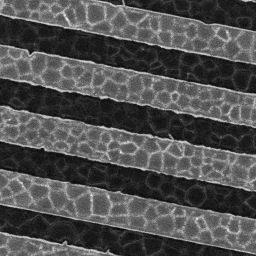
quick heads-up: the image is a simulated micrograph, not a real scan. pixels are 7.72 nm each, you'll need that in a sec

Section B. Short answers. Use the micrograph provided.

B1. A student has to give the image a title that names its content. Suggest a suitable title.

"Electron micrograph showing one or a few lines or trenches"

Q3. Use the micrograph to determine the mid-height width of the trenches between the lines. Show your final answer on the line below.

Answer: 224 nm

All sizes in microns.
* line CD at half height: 0.255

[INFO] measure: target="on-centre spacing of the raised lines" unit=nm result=476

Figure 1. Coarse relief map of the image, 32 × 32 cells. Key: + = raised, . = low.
++++++++++++++..................
++++++++++++++++++++............
...+++++++++++++++++++++........
........++++++++++++++++++++++..
.............+++++++++++++++++++
...................+++++++++++++
+++.....................++++++++
++++++++++...................+++
++++++++++++++..................
++++++++++++++++++++............
....+++++++++++++++++++++.......
.........+++++++++++++++++++++..
..............++++++++++++++++++
+...................++++++++++++
+++++....................+++++++
+++++++++++...................++
++++++++++++++++................
++++++++++++++++++++++..........
....++++++++++++++++++++++......
..........++++++++++++++++++++++
..............++++++++++++++++++
+...................++++++++++++
++++++...................+++++++
++++++++++++..................++
+++++++++++++++++...............
++++++++++++++++++++++..........
.....++++++++++++++++++++++.....
..........++++++++++++++++++++++
................++++++++++++++++
++..................++++++++++++
++++++++.................+++++++
++++++++++++...................+